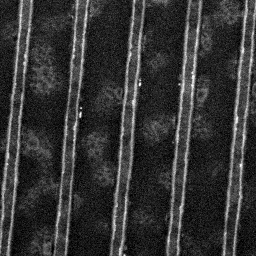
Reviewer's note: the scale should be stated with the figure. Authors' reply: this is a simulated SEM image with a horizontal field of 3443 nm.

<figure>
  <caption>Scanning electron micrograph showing parallel lines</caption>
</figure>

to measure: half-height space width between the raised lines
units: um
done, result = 0.613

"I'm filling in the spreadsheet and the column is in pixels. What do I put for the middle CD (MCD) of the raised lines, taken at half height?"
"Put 10.7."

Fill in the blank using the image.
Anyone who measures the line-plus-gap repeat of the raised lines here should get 753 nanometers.